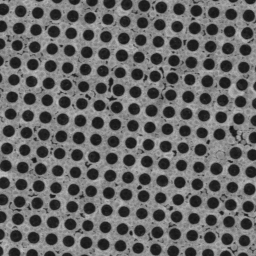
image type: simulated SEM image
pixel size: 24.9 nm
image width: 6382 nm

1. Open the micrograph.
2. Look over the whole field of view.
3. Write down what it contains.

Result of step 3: a regular array of holes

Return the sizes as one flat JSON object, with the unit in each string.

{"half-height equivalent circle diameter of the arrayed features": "11 pixels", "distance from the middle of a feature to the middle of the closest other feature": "421 nm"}